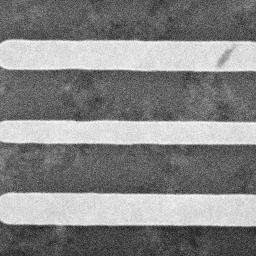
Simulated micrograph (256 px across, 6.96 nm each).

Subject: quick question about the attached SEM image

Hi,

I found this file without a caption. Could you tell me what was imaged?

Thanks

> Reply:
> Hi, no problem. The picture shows groups of lines, slits or small figures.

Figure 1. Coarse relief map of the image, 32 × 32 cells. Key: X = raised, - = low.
--------------------------------
--------------------------------
--------------------------------
--------------------------------
--------------------------------
XXXXXXXXXXXXXXXXXXXXXXXXXXXXXXXX
XXXXXXXXXXXXXXXXXXXXXXXXXXXXXXXX
XXXXXXXXXXXXXXXXXXXXXXXXXXXXXXXX
-XXXXXXXX-XXXXXXXXXXXXXXXXXXXXXX
--------------------------------
--------------------------------
--------------------------------
--------------------------------
--------------------------------
--------------------------------
XXXXXXXXXXXXXXXXXXXXXXXXXXXXXXXX
XXXXXXXXXXXXXXXXXXXXXXXXXXXXXXXX
XXXXXXXXXXXXXXXXXXXXXXXXXXXXXXXX
--------------------------------
--------------------------------
--------------------------------
--------------------------------
--------------------------------
--------------------------------
XXXXXXXXXXXXXXXXXXXXXXXXXXXXXXXX
XXXXXXXXXXXXXXXXXXXXXXXXXXXXXXXX
XXXXXXXXXXXXXXXXXXXXXXXXXXXXXXXX
XXXXXXXXXXXXXXXXXXXXXXXXXXXXXXXX
--------------------------------
--------------------------------
--------------------------------
--------------------------------